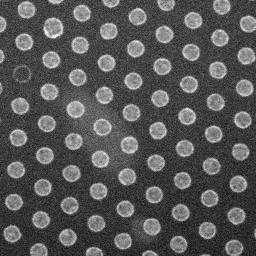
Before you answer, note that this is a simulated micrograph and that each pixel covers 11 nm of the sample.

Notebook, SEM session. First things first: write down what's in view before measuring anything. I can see a regular array of raised bodies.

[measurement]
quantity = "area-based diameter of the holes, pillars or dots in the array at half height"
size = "0.173 µm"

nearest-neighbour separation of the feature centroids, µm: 0.351